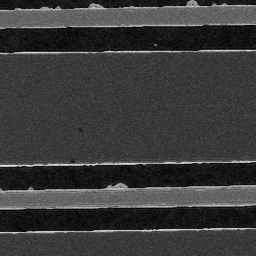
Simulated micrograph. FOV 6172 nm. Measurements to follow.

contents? lines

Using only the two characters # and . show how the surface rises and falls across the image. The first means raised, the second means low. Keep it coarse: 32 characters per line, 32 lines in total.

................................
################################
################################
#...............................
................................
................................
.............###################
################################
################################
################################
################################
################################
################################
################################
################################
################################
################################
################################
################################
################################
##################..............
................................
................................
..................##############
################################
################################
................................
................................
................................
################################
################################
################################